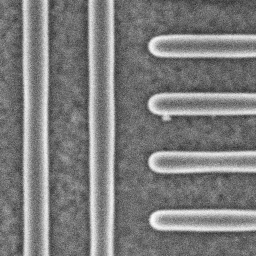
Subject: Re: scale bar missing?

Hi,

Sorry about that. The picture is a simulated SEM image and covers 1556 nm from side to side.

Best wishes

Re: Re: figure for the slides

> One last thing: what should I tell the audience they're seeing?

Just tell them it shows groups of lines, slits or small figures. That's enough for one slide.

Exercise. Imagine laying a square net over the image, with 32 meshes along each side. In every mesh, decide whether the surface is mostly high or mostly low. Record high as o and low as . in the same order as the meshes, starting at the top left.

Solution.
...ooo.....ooo..................
...ooo.....ooo..................
...ooo.....ooo..................
...ooo.....ooo..................
...ooo.....ooo.........ooo......
...ooo.....ooo.....ooooooooooooo
...ooo.....ooo.....ooooooooooooo
...ooo.....ooo..................
...ooo.....ooo..................
...ooo.....ooo..................
...ooo.....ooo..................
...ooo.....ooo..................
...ooo.....ooo.....ooooooooooooo
...ooo.....ooo.....ooooooooooooo
...ooo.....ooo..................
...ooo.....ooo..................
...ooo.....ooo..................
...ooo.....ooo..................
...ooo.....ooo..................
...ooo.....ooo.....ooooooooooooo
...ooo.....ooo.....ooooooooooooo
...ooo.....ooo......oo..........
...ooo.....ooo..................
...ooo.....ooo..................
...ooo.....ooo..................
...ooo.....ooo..................
...ooo.....ooo......oooooooooooo
...ooo.....ooo.....ooooooooooooo
...ooo......oo......oooooooooooo
...ooo......oo..................
...ooo......oo..................
...ooo.....ooo..................